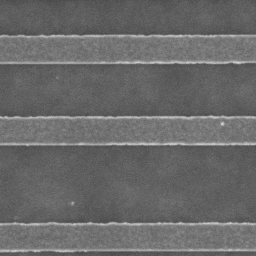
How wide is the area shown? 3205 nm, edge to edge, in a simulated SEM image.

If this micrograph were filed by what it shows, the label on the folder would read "lines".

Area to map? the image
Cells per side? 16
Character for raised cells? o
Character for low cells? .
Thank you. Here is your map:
................
................
oooooooooooooooo
oooooooooooooooo
................
................
................
oooooooooooooooo
oooooooooooooooo
................
................
................
................
................
oooooooooooooooo
oooooooooooooooo